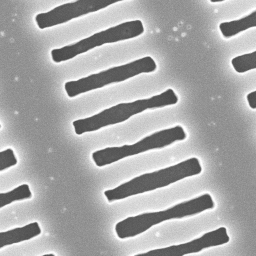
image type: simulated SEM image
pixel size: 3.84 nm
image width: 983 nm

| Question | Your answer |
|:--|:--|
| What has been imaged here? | holes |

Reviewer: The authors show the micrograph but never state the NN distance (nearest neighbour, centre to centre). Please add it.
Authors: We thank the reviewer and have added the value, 0.143 µm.